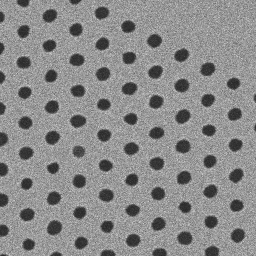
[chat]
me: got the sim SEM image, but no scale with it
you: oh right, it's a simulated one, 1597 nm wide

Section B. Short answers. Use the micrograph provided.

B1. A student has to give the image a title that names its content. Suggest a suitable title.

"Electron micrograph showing a regular array of holes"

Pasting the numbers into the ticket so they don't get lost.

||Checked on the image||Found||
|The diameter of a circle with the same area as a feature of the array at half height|85.2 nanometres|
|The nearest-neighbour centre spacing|185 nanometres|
